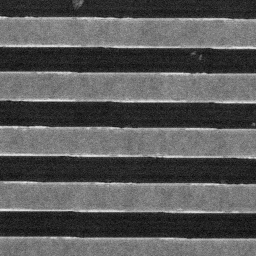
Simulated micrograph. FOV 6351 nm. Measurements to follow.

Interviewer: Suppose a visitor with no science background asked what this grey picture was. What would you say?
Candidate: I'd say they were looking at lines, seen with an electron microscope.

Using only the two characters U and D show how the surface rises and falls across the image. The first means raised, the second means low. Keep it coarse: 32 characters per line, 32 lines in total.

DDDDDDDDDDDDDDDDDDDDDDDDDDDDDDDD
DDDDDDDDDDDDDDDDDDDDDDDDDDDDDDDD
UUUUUUUUUUUUUUUUUUUUUUUUUUUUUDUD
UUUUUUUUUUUUUUUUUUUUUUUUUUUUUUUU
UUUUUUUUUUUUUUUUUUUUUUUUUUUUUUUU
UUUUUUUUUUUUUUUUUUUUUUUUUUUUUUUU
DDDDDDDDDDDDDDDDDDDDDDDDDDDDDDDD
DDDDDDDDDDDDDDDDDDDDDDDDDDDDDDDD
DDDDDDDDDDDDDDDDDDDDDDDDDDDDDDDD
UUUUUUUUUUUUUUUUUUUUUUUUUUUUUUUU
UUUUUUUUUUUUUUUUUUUUUUUUUUUUUUUU
UUUUUUUUUUUUUUUUUUUUUUUUUUUUUUUU
DUUUUUUUUUUUUUUUUUUUUUUUUUUUUUUU
DDDDDDDDDDDDDDDDDDDDDDDDDDDDDDDD
DDDDDDDDDDDDDDDDDDDDDDDDDDDDDDDD
DDDDDDDDDDDDDDDDDDDDDDDDDDDDDDDD
UUUUUUUUUUUUUUUUUUUUUUUUUUUUUUUU
UUUUUUUUUUUUUUUUUUUUUUUUUUUUUUUU
UUUUUUUUUUUUUUUUUUUUUUUUUUUUUUUU
DDDDDDDDDDDDDDDDDDDUUUUUUUUUUUUU
DDDDDDDDDDDDDDDDDDDDDDDDDDDDDDDD
DDDDDDDDDDDDDDDDDDDDDDDDDDDDDDDD
DDDDDDDDDDDDDDDDDDDDDDDDDDDDDDDD
UUUUUUUUUUUUUUUUUUUUUUUUUUUUUUUU
UUUUUUUUUUUUUUUUUUUUUUUUUUUUUUUU
UUUUUUUUUUUUUUUUUUUUUUUUUUUUUUUU
DDDDDDDDDDDDDDDDDDDDUUUUUUUUUUUU
DDDDDDDDDDDDDDDDDDDDDDDDDDDDDDDD
DDDDDDDDDDDDDDDDDDDDDDDDDDDDDDDD
DDDDDDDDDDDDDDDDDDDDDDDDDDDDDDDD
UUUUUUUUUUUUUUUUUUUUUUUUUUUUUUUU
UUUUUUUUUUUUUUUUUUUUUUUUUUUUUUUU